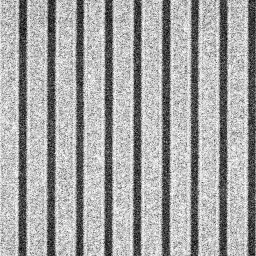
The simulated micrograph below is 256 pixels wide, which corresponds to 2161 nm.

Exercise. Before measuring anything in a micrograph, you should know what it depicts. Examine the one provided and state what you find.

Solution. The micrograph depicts parallel lines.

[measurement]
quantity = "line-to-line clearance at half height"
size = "0.0823 microns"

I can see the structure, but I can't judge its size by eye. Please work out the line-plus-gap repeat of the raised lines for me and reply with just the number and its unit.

242 nanometres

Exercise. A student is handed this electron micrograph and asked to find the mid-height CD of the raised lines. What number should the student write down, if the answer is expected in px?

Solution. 18.6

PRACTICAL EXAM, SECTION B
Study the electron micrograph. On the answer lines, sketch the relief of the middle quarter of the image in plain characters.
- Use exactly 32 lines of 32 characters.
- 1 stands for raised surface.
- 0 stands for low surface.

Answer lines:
11100111110001111000111100011110
11100111110001111000111100011110
11100111110001111000111100011110
11100111110001111000111100011110
11100111110001111000111100011110
11100111110001111000111100011110
11100111110001111000111100011110
11100111110001111000111100011110
11100111110001111000111100011110
11100111110001111000111100011110
11100111110001111000111100011110
11100111110001111000111100011110
11100111110001111000111100011110
11100111110001111000111100011110
11100111110001111000111100011110
11100111110001111000111100011110
11100111110001111000111100011110
11100111110001111000111100011110
11100111110001111000111100011110
11100111110001111000111100011110
11100111110001111000111100011110
11100111110001111000111100011110
11100111110001111000111100011110
11100111110001111000111100011110
11100111110001111000111100011110
11100111110001111000111100011110
11100111110001111000111100011110
11100111110001111000111100011110
11100111110001111000111100011110
11100111110001111000111100011110
11100111110001111000111100011110
11100111110001111000111100011110